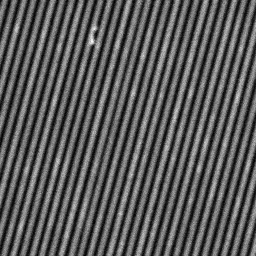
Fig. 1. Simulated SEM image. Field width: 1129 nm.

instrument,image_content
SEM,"parallel lines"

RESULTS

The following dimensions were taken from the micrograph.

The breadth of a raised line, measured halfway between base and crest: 21.8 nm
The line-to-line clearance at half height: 17.6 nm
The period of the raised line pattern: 0.0408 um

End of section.